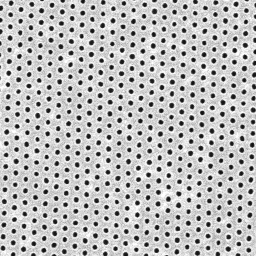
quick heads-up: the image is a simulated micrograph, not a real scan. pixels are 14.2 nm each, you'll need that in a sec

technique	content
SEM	a regular array of holes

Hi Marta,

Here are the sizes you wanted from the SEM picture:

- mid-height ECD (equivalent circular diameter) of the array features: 77 nm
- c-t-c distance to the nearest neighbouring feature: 162 nm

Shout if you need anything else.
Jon